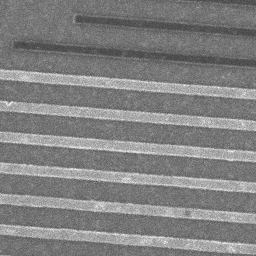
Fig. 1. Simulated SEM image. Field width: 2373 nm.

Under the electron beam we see parallel lines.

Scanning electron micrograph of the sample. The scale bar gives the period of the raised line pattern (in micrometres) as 0.286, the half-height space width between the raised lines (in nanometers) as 198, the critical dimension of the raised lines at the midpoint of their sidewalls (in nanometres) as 86.6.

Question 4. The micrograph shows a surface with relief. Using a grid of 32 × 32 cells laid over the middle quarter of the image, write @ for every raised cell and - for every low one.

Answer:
--------------------------------
--------------------------------
--------------------------------
@@@@@@@@@-----------------------
@@@@@@@@@@@@@@@@@@@@@-----------
-------@@@@@@@@@@@@@@@@@@@@@@@@@
--------------------@@@@@@@@@@@@
--------------------------------
--------------------------------
--------------------------------
--------------------------------
@@@@@@@@@@@@--------------------
@@@@@@@@@@@@@@@@@@@@@@----------
--------@@@@@@@@@@@@@@@@@@@@@@@@
---------------------@@@@@@@@@@@
--------------------------------
--------------------------------
--------------------------------
@-------------------------------
@@@@@@@@@@@@@-------------------
@@@@@@@@@@@@@@@@@@@@@@@@@@@@@---
------------@@@@@@@@@@@@@@@@@@@@
------------------------@@@@@@@@
--------------------------------
--------------------------------
--------------------------------
@@@@----------------------------
@@@@@@@@@@@@@@@@@---------------
---@@@@@@@@@@@@@@@@@@@@@@@@@@@--
---------------@@@@@@@@@@@@@@@@@
----------------------------@@@@
--------------------------------